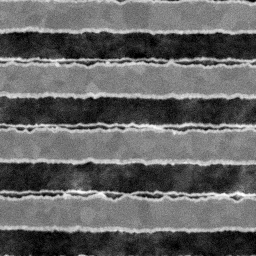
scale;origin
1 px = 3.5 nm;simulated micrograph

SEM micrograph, lines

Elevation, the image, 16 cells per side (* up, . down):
****************
****************
................
................
****************
****************
................
................
****************
****************
................
................
****************
****************
................
................